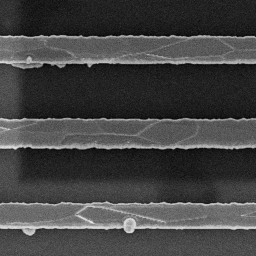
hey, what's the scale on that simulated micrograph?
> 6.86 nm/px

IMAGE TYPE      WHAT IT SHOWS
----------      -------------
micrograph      lines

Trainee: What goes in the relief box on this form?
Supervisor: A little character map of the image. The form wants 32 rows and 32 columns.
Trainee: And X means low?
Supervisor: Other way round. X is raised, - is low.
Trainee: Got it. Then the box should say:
--------------------------------
--------------------------------
--------------------------------
--------------------------------
--X--XXXX------XXX---X--XX------
XXXXXXXXXXXXXXXXXXXXXXXXXXXXXXXX
XXXXXXXXXXXXXXXXXXXXXXXXXXXXXXXX
XXXXXXXXXXXXXXXXXXXXXXXXXXXXXXXX
--------------------------------
--------------------------------
--------------------------------
--------------------------------
--------------------------------
--------------------------------
--------------------------------
XXXXXXXXXXXXXXXXXXXXXXXXXXXXXXXX
XXXXXXXXXXXXXXXXXXXXXXXXXXXXXXXX
XXXXXXXXXXXXXXXXXXXXXXXXXXXXXXXX
-X-----X-XX--X------XX-X----XX--
--------------------------------
--------------------------------
--------------------------------
--------------------------------
--------------------------------
--------------------------------
XXXXXX-XXXXXXXXXXXXXXXXXXXXXXXXX
XXXXXXXXXXXXXXXXXXXXXXXXXXXXXXXX
XXXXXXXXXXXXXXXXXXXXXXXXXXXXXXXX
XXXXX-XXXXXXXXXXXXXXXXXXXXXXXXXX
--------------------------------
--------------------------------
--------------------------------